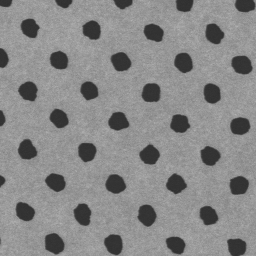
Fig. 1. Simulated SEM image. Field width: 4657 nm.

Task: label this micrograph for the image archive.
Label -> a regular array of holes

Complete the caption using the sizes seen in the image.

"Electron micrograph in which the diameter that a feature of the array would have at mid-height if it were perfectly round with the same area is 18.9 px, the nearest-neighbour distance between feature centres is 763 nm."